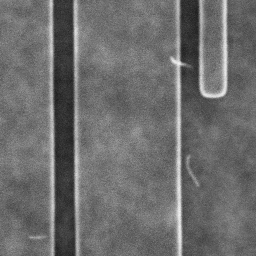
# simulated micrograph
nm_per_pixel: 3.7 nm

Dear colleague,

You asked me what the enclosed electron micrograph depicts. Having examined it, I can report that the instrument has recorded groups of lines, slits or small figures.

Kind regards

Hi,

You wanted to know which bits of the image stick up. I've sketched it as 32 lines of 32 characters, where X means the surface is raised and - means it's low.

XXXXXX---XXXXXXXXXXXXX---XXX----
XXXXXX---XXXXXXXXXXXXX---XXX----
XXXXXX---XXXXXXXXXXXXX---XXX----
XXXXXX---XXXXXXXXXXXXX---XXX----
XXXXXXX--XXXXXXXXXXXXX---XXX----
XXXXXXX--XXXXXXXXXXXXX---XXX----
XXXXXXX--XXXXXXXXXXXXX---XXX----
XXXXXXX--XXXXXXXXXXXXXX--XXX----
XXXXXXX--XXXXXXXXXXXXXX--XXX----
XXXXXXX--XXXXXXXXXXXXX---XXX----
XXXXXXX--XXXXXXXXXXXXX---XXX----
XXXXXXX--XXXXXXXXXXXXX---XXX----
XXXXXXX--XXXXXXXXXXXXX----------
XXXXXXX--XXXXXXXXXXXXX----------
XXXXXXX--XXXXXXXXXXXXX----------
XXXXXXX--XXXXXXXXXXXXX----------
XXXXXXX--XXXXXXXXXXXXX----------
XXXXXXX--XXXXXXXXXXXXX----------
XXXXXXX--XXXXXXXXXXXXX----------
XXXXXXX--XXXXXXXXXXXXX----------
XXXXXXX--XXXXXXXXXXXXX----------
XXXXXXX---XXXXXXXXXXXX----------
XXXXXXX---XXXXXXXXXXXX----------
XXXXXXX---XXXXXXXXXXXX----------
XXXXXXX---XXXXXXXXXXXXX---------
XXXXXXX---XXXXXXXXXXXXX---------
XXXXXXX---XXXXXXXXXXXXX---------
XXXXXXX---XXXXXXXXXXXXX---------
XXXXXXX---XXXXXXXXXXXXX---------
XXXXXXX---XXXXXXXXXXXXX---------
XXXXXXX---XXXXXXXXXXXXX---------
XXXXXXX---XXXXXXXXXXXXX---------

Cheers